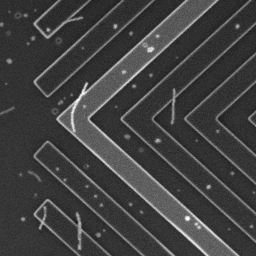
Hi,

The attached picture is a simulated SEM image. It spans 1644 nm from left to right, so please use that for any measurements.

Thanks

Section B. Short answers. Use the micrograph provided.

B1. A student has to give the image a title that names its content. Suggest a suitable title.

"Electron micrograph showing groups of lines, slits or small figures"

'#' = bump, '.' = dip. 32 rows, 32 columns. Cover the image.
.......####....####....####....#
......####....####....####....##
.....####....####....####...####
.....##.....####....####...#####
..........####....####....####..
.........####....####....####...
........####....####....####....
.......####....####....####....#
......####....####....####....##
.....####....####....####....###
....####....####....####....####
.....##....####....####....####.
..........####....####...####...
........####....####....####....
.......#####...####....####....#
........####....####....####....
.........####....####....####...
..........####....####....####..
.....##....####....####....####.
....####....####....####....####
.....####....####....####....###
......####....####....####....##
.......####....####....####....#
........####....####....####....
..........####....####....####..
.....##....####....####....####.
....####....####....####....####
.....####....####....####....###
......####....####....####....##
.......####....####....####....#
........####....####....####....
.........####....####....####...